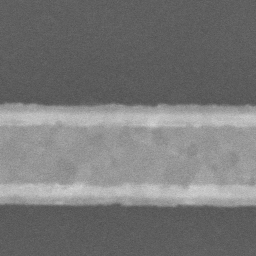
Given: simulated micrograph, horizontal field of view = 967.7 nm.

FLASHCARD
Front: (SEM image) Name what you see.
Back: one or a few lines or trenches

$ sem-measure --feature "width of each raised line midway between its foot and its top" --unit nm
275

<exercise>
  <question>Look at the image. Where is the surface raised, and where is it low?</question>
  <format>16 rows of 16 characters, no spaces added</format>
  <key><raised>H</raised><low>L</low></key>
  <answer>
LLLLLLLLLLLLLLLL
LLLLLLLLLLLLLLLL
LLLLLLLLLLLLLLLL
LLLLLLLLLLLLLLLL
LLLLLLLLLLLLLLLL
LLLLLLLLLLLLLLLL
LLLLLLLLLLLLLLLL
HHHHHHHHHHHHHHHH
HHHHHHHHHHHHHHHH
HHHHHHHHHHHHHHHH
HHHHHHHHHHHHHHHH
HHHHHHHHHHHHHHHH
LLLLLLLLLLLLLLLL
LLLLLLLLLLLLLLLL
LLLLLLLLLLLLLLLL
LLLLLLLLLLLLLLLL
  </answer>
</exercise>